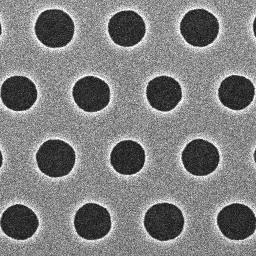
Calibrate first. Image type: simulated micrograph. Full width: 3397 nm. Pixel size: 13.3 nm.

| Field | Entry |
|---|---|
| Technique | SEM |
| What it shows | a regular array of holes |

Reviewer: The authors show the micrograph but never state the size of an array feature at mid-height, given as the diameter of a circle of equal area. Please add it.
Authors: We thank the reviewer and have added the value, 0.502 microns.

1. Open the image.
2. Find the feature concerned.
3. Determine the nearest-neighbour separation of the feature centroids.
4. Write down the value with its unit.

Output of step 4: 956 nm